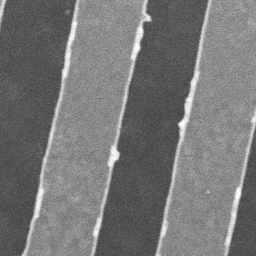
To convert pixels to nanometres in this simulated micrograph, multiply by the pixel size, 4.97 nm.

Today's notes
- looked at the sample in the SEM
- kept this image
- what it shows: one or a few lines or trenches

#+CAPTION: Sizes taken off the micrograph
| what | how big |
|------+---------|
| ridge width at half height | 339 nanometers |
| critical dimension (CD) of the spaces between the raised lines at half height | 306 nm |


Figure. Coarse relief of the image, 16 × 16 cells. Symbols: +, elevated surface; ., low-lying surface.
.....++++....+++
.....++++....+++
....+++++....+++
....+++++...++++
....++++....++++
....++++....++++
....++++....++++
...+++++...+++++
...++++....+++++
...++++....+++++
...++++....++++.
...++++....++++.
..+++++...+++++.
..++++....+++++.
..++++....++++..
..++++....++++..